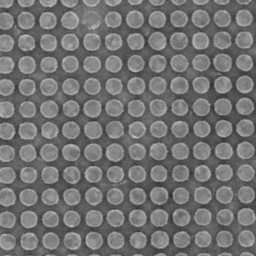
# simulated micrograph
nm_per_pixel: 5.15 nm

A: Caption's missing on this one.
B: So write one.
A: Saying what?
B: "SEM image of a regular array of raised bodies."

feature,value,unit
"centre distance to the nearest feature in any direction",111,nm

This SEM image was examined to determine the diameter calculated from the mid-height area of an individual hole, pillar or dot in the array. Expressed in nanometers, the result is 84.6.